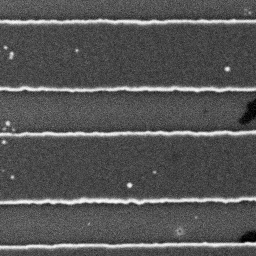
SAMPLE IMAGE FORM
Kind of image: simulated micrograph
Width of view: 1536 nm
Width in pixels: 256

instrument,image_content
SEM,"lines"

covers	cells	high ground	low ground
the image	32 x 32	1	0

00000000000000000000000000000000
00000000000000000000000000000000
00000000000011000000000000000100
11111111111111111111111111111111
11111111111111111111111111111111
11111111111111111111111111111111
11111111111111111111111111111111
11111111111111111111111111111111
11111111111111111111111111111111
11111111111111111111111111111111
11111111111111111111111111111111
00000000000000000000000000000000
00000000000000000000000000000000
00000000000000000000000000000000
00000000000000000000000000000000
00000000000000000000000000000000
00000000000000000011111100011011
11111111111111111111111111111111
11111111111111111111111111111111
11111111111111111111111111111111
11111111111111111111111111111111
11111111111111111111111111111111
11111111111111111111111111111111
11111111111111111111111111111111
11111111111111111111111111111111
00000000100000000000000000000000
00000000000000000000000000000000
00000000000000000000000000000000
00000000000000000000000000000000
00000000000000000000000000000000
00000000000000000000111111111111
11111111111111111111111111111111